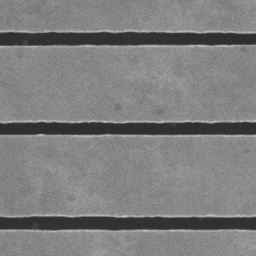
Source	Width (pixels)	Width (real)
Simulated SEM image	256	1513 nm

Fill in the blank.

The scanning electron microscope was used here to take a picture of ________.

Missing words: lines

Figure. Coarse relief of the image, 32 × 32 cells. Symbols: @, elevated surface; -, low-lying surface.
@@@@@@@@@@@@@@@@@@@@@@@@@@@@@@@@
@@@@@@@@@@@@@@@@@@@@@@@@@@@@@@@@
@@@@@@@@@@@@@@@@@@@@@@@@@@@@@@@@
@@@@@@@@@@@@@@@@@@@@@@@@@@@@@@@@
--------------------------------
--------------------------------
@@@@@@@@@@@@@@@@@@@@@@@@@@@@@@@@
@@@@@@@@@@@@@@@@@@@@@@@@@@@@@@@@
@@@@@@@@@@@@@@@@@@@@@@@@@@@@@@@@
@@@@@@@@@@@@@@@@@@@@@@@@@@@@@@@@
@@@@@@@@@@@@@@@@@@@@@@@@@@@@@@@@
@@@@@@@@@@@@@@@@@@@@@@@@@@@@@@@@
@@@@@@@@@@@@@@@@@@@@@@@@@@@@@@@@
@@@@@@@@@@@@@@@@@@@@@@@@@@@@@@@@
@@@@@@@@@@@@@@@@@@@@@@@@@@@@@@@@
--------------------------------
--------------------------------
@@@@@@@@@@@@@@@@@@@@@@@@@@@@@@@@
@@@@@@@@@@@@@@@@@@@@@@@@@@@@@@@@
@@@@@@@@@@@@@@@@@@@@@@@@@@@@@@@@
@@@@@@@@@@@@@@@@@@@@@@@@@@@@@@@@
@@@@@@@@@@@@@@@@@@@@@@@@@@@@@@@@
@@@@@@@@@@@@@@@@@@@@@@@@@@@@@@@@
@@@@@@@@@@@@@@@@@@@@@@@@@@@@@@@@
@@@@@@@@@@@@@@@@@@@@@@@@@@@@@@@@
@@@@@@@@@@@@@@@@@@@@@@@@@@@@@@@@
@@@@@@@@@@@@@@@@@@@@@@@@@@@@@@@@
--------------------------------
--------------------------------
@@@@@@@@@@@@@@@@@@@@@@@@@@@@@@@@
@@@@@@@@@@@@@@@@@@@@@@@@@@@@@@@@
@@@@@@@@@@@@@@@@@@@@@@@@@@@@@@@@